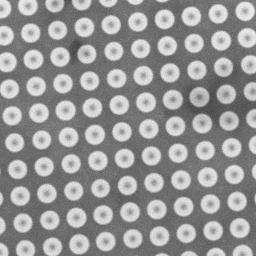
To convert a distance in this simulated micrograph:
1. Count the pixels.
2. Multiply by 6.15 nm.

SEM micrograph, an array of small figures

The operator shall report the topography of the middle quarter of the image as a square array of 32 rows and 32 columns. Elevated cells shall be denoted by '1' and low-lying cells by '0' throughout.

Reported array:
00000000000000000000000001110001
00000000000011000011110011111001
00000111000111100011110011111001
10001111100111100011110001110000
11001111100111100011110000000000
11000111000011000000000000000000
10000000000000000000000000000000
00000000000000000001110001111000
00000000000011100011111001111000
10000111100011110011111001111100
11100111100011110011111001111000
11100111100011110001110000000000
11100111100000000000000000000000
11000000000000000000000000011000
00000000000000000000111000111100
00000001100001110001111000111100
11100011110011111001111100111100
11100111110011111001111000011000
11100111110001110000010000000000
11100011100000000000000000000000
11000000000000000000000000011100
00000000000000110000111000111110
00000001110001111000111100111110
11100011111001111000111100011110
11110011111001111000111100000000
11110001110000111000000000000000
11100000100000000000000000000000
00000000000000000000001000011110
00000000000000011000011110011110
00000000111000111100111110011111
01110001111000111100111110011110
11111001111000111100011100000000